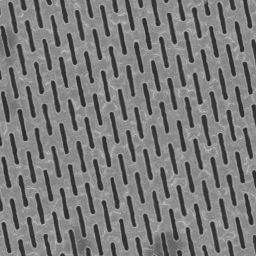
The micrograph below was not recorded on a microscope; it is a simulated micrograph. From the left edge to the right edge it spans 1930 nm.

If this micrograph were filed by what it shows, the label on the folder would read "a regular array of holes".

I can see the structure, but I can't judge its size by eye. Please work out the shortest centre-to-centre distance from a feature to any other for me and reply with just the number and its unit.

24.3 pixels